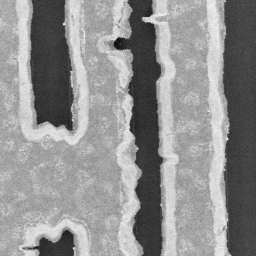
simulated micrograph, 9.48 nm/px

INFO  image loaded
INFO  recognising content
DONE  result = one or a few lines or trenches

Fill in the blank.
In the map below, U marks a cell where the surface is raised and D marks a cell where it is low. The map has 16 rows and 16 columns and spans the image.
UUDDDUUUDDUUUDDD
UDDDDUUDDDUUUDDD
UUDDDUUDDDUUUDDD
UDDDDUUDDDUUUDDD
UDDDDUUUDDDUUDDD
UUDDDUUUDDUUUDDD
UUDDDUUUDDUUUUDD
UUDDDUUUDDUUUUDD
UUUUDUUUDDUUUUDD
UUUUUUUUDDDUUUDD
UUUUUUUUDDDUUUDD
UUUUUUUUDDDUUDDD
UUUUUUUUDDDUUUDD
UUUUUUUUDDDUUUDD
UUDDDUUUDDDUUUDD
UUDDDUUUDDDUUUDD